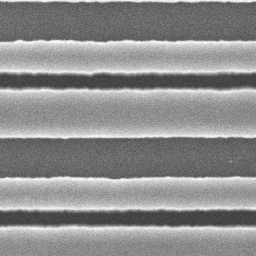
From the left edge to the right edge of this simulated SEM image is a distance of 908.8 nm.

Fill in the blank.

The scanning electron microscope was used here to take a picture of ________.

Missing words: lines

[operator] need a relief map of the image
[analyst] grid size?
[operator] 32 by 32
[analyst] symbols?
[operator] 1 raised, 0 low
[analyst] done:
00000000000000000000000000000000
00000000000000000000000000000000
00000000000000000000000000000000
00000000000000000000000000000000
00000000000000000000000000000000
11111111111111111111111111111111
11111111111111111111111111111111
11111111111111111111111111111111
11111111111111111111111111111111
00000000000000000000000000000000
00000000000000000000000000000000
11111111111111111111111111111111
11111111111111111111111111111111
11111111111111111111111111111111
11111111111111111111111111111111
11111111111111111111111111111111
11111111111111111111111111111111
00000000000000000000000000000000
00000000000000000000000000000000
00000000000000000000000000000000
00000000000000000000000000000000
00000000000000000000000000000000
11111111111111011111111111111111
11111111111111111111111111111111
11111111111111111111111111111111
11111111111111111111111111111111
00000000000000000000000000000000
00000000000000000000000000000000
11111111111111111111111111111111
11111111111111111111111111111111
11111111111111111111111111111111
11111111111111111111111111111111